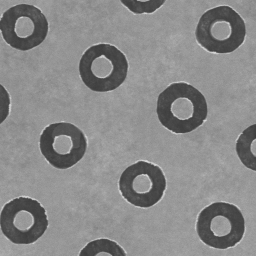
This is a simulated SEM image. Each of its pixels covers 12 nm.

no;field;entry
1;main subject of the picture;ring-shaped grooves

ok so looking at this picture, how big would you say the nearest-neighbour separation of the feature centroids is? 1040 nm